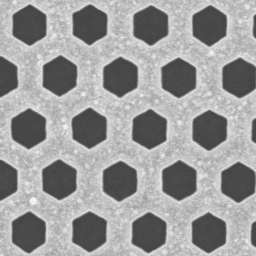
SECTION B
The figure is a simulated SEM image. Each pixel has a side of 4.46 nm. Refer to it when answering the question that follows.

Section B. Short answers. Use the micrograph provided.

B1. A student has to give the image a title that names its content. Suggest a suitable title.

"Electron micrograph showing a regular array of holes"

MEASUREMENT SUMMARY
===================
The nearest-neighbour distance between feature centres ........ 263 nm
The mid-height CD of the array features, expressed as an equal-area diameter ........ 0.165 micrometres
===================